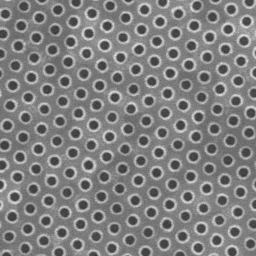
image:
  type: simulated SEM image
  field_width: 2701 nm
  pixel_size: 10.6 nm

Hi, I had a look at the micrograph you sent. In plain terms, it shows a regular array of holes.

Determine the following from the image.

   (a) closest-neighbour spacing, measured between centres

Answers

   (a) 206 nanometers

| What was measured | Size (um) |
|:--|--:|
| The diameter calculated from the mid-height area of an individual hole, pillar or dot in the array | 0.11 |